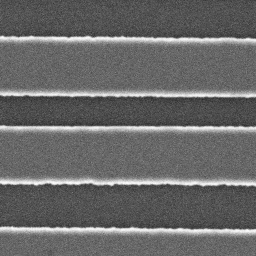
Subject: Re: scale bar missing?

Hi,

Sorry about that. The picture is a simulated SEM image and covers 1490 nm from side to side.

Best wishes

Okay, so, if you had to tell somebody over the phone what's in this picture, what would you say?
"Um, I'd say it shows lines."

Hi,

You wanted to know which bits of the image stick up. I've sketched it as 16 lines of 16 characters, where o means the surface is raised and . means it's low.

................
................
oooooooooooooooo
oooooooooooooooo
oooooooooooooooo
oooooooooooooooo
................
................
oooooooooooooooo
oooooooooooooooo
oooooooooooooooo
......o....ooooo
................
................
oooooooooooooooo
oooooooooooooooo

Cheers